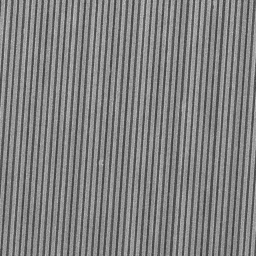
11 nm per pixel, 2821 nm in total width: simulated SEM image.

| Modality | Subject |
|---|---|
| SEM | parallel lines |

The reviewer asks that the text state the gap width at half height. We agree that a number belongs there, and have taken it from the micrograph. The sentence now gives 31.6 nm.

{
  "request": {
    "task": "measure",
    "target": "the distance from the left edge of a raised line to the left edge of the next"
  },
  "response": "66.5 nanometres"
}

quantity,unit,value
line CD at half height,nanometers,41.2